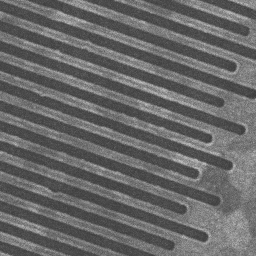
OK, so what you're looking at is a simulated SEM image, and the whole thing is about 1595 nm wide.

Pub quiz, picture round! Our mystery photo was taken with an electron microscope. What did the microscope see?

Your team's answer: parallel lines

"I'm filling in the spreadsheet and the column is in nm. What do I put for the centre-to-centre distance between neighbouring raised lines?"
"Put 118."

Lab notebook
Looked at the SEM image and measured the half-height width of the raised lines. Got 48.5 nm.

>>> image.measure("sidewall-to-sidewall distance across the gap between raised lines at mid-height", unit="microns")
0.0647